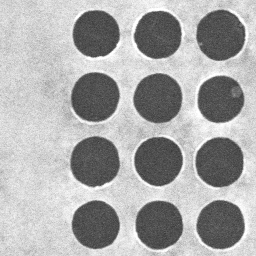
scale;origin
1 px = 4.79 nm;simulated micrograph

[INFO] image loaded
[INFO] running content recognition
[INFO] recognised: a regular array of holes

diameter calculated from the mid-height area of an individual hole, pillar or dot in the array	233	nanometers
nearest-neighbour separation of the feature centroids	0.298	µm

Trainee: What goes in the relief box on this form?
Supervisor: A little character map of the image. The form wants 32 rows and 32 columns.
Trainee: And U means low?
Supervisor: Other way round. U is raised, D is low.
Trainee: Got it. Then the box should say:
UUUUUUUUUUUUUUUUUUUUUUUUUUUUUUUU
UUUUUUUUUUUDDUUUUUUDDUUUUUDDDUUU
UUUUUUUUUUDDDDUUUDDDDDUUUDDDDDUU
UUUUUUUUUDDDDDDUUDDDDDDUUDDDDDDU
UUUUUUUUUDDDDDDUUDDDDDDUDDDDDDDU
UUUUUUUUUDDDDDDUUDDDDDDUUDDDDDDU
UUUUUUUUUUDDDDUUUUDDDDUUUDDDDDUU
UUUUUUUUUUUUUUUUUUUUUUUUUUUDUUUU
UUUUUUUUUUUUUUUUUUUUUUUUUUUUUUUU
UUUUUUUUUUDDDDUUUUDDDUUUUUUDUUUU
UUUUUUUUUDDDDDDUUDDDDDUUUDDDDDUU
UUUUUUUUUDDDDDDUUDDDDDDUUDDDDDUU
UUUUUUUUUDDDDDDUUDDDDDDUUDDDDDDU
UUUUUUUUUDDDDDDUUDDDDDDUUDDDDDUU
UUUUUUUUUUDDDDUUUUDDDDUUUDDDDDUU
UUUUUUUUUUUUUUUUUUUUUUUUUUUUUUUU
UUUUUUUUUUUUUUUUUUUUUUUUUUUUUUUU
UUUUUUUUUUDDDDUUUUDDDUUUUUDDDUUU
UUUUUUUUUDDDDDDUUDDDDDUUUDDDDDUU
UUUUUUUUUDDDDDDUUDDDDDDUUDDDDDUU
UUUUUUUUUDDDDDDUUDDDDDDUDDDDDDDU
UUUUUUUUUDDDDDDUUDDDDDUUUDDDDDUU
UUUUUUUUUUDDDDUUUUDDDDUUUDDDDDUU
UUUUUUUUUUUUUUUUUUUUUUUUUUUUUUUU
UUUUUUUUUUUUUUUUUUUUUUUUUUUUUUUU
UUUUUUUUUUUDDUUUUUDDDDUUUUDDDUUU
UUUUUUUUUDDDDDUUUDDDDDUUUDDDDDUU
UUUUUUUUUDDDDDDUUDDDDDDUUDDDDDUU
UUUUUUUUUDDDDDDUUDDDDDDUUDDDDDDU
UUUUUUUUUDDDDDDUUDDDDDDUUDDDDDUU
UUUUUUUUUUDDDDUUUUDDDDUUUUDDDUUU
UUUUUUUUUUUUUUUUUUUUUUUUUUUUUUUU